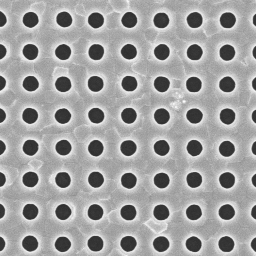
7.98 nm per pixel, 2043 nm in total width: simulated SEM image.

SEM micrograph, a regular array of holes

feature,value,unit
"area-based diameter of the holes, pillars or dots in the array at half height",127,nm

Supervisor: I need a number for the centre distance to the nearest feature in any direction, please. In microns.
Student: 0.254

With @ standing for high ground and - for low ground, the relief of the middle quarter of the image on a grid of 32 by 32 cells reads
@@@@@@@@@@@@@@@@@@@@@@@@@@@@@@@@
@@@@@@@@@@@@@@@@@@@@@@@@@@@@@@@@
@@@@@@@@@@@@@@@@@@@@@@@@@@@@@@@@
-@@@@@---@@@@@@---@@@@@---@@@@@-
--@@@@----@@@@----@@@@@---@@@@@-
--@@@@----@@@@----@@@@@---@@@@@-
-@@@@@@--@@@@@@---@@@@@---@@@@@-
@@@@@@@@@@@@@@@@@@@@@@@@@@@@@@@@
@@@@@@@@@@@@@@@@@@@@@@@@@@@@@@@@
@@@@@@@@@@@@@@@@@@@@@@@@@@@@@@@@
@@@@@@@@@@@@@@@@@@@@@@@@@@@@@@@@
-@@@@@@--@@@@@@---@@@@@---@@@@@-
--@@@@----@@@@----@@@@@---@@@@@-
--@@@@----@@@@----@@@@----@@@@@-
-@@@@@@--@@@@@@---@@@@@---@@@@@-
@@@@@@@@@@@@@@@@@@@@@@@@@@@@@@@@
@@@@@@@@@@@@@@@@@@@@@@@@@@@@@@@@
@@@@@@@@@@@@@@@@@@@@@@@@@@@@@@@@
@@@@@@@@@@@@@@@@@@@@@@@@@@@@@@@@
-@@@@@@--@@@@@@--@@@@@@---@@@@@-
--@@@@----@@@@----@@@@----@@@@@-
--@@@@----@@@@----@@@@----@@@@@-
-@@@@@@--@@@@@@--@@@@@@---@@@@@-
@@@@@@@@@@@@@@@@@@@@@@@@@@@@@@@@
@@@@@@@@@@@@@@@@@@@@@@@@@@@@@@@@
@@@@@@@@@@@@@@@@@@@@@@@@@@@@@@@@
@@@@@@@@@@@@@@@@@@@@@@@@@@@@@@@@
-@@@@@@--@@@@@@--@@@@@@---@@@@@-
--@@@@----@@@@----@@@@----@@@@--
--@@@@----@@@@----@@@@----@@@@@-
-@@@@@@--@@@@@@---@@@@@---@@@@@-
@@@@@@@@@@@@@@@@@@@@@@@@@@@@@@@@